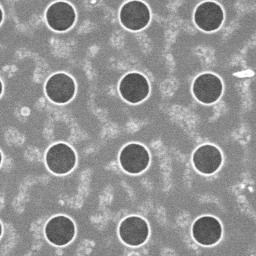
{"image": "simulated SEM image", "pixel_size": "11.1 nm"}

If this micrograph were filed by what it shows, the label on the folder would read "a regular array of holes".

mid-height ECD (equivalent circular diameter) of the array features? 334 nm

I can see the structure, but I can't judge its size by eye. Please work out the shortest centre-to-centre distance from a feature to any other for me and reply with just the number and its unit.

792 nm